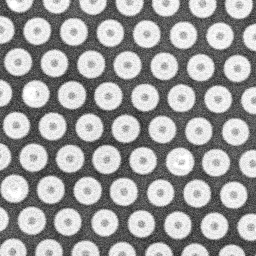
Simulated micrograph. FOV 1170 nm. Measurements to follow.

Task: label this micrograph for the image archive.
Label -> an array of small figures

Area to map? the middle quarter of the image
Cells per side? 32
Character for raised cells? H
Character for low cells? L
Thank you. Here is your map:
HLLHHHHHHHLLLHHHHHHLLLHHHHHHLLLH
LLLLHHHHHHLLLHHHHHHLLLHHHHHHLLLH
LLLLHHHHHLLLLHHHHHLLLLHHHHHHLLLH
LLLLLLLLLLLLLLLHHLLLLLLHHHHLLLLL
LLLLLLLLLLLLLLLLLLLLLLLLLLLLLLLL
HHHHHLLLLHHHHLLLLLLHHHLLLLLLHHHL
HHHHHLLLHHHHHHLLLHHHHHHLLLLHHHHH
HHHHHLLLHHHHHHLLLHHHHHHLLLHHHHHH
HHHHHLLLHHHHHHLLLHHHHHHHLLHHHHHH
HHHHHLLLHHHHHHLLLHHHHHHLLLHHHHHH
HHHHLLLLLHHHHLLLLLHHHHHLLLLHHHHH
LLLLLLLLLLLLLLLLLLLHHLLLLLLLHHHL
LLLLLLLLLLLLLLLLLLLLLLLLLLLLLLLL
LLLLHHHHHLLLLHHHHHLLLLLHHHLLLLLL
LLLHHHHHHLLLHHHHHHLLLLHHHHHLLLLH
LLLHHHHHHHLLHHHHHHHLLHHHHHHHLLLH
LLLHHHHHHHLLHHHHHHHLLHHHHHHHLLLH
LLLHHHHHHLLLHHHHHHHLLHHHHHHHLLHH
LLLLHHHHHLLLLHHHHHLLLLHHHHHLLLLH
LLLLLLLLLLLLLLLHLLLLLLLHHHLLLLLL
HHHLLLLLLLHHLLLLLLLLLLLLLLLLLLLL
HHHHLLLLHHHHHLLLLLHHHHLLLLLHHHHL
HHHHHLLHHHHHHHLLLHHHHHHLLLHHHHHH
HHHHHLLHHHHHHHLLLHHHHHHLLLHHHHHH
HHHHHLLHHHHHHHLLHHHHHHHLLLHHHHHH
HHHHLLLLHHHHHHLLLHHHHHHLLLHHHHHH
HHHLLLLLHHHHHLLLLHHHHHLLLLHHHHHH
LLLLLLLLLLLLLLLLLLLLLLLLLLLHHHHL
LLLLLHHLLLLLLLLLLLLLLLLLLLLLLLLL
LLLHHHHHLLLLLHHHHLLLLLHHHHLLLLLL
LLLHHHHHHLLLHHHHHHLLLHHHHHHLLLHH
LLLHHHHHHLLLHHHHHHLLLHHHHHHLLLHH